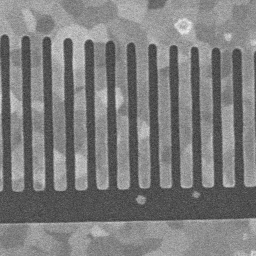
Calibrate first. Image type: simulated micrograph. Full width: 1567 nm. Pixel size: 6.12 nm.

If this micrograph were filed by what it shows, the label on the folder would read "groups of lines, slits or small figures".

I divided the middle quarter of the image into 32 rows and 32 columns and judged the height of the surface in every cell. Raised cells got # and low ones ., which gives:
..###...##...###..###...##...##.
...##...##...###..###...##...##.
...##...##...###..###...##...##.
...##...##...###..###...##...##.
...##...##...###..###...##...##.
...##...##...###..###...##...##.
...##...###..###..###...##...###
...##...###..###..###...##...###
...##...###..###..###...##...###
...##...###....#..###...##...###
...##...###..###..###...##...###
...##...###..###..###...##...###
...##...###..###..###...##...###
...##...###..###..###...##...###
...##...###..###..###...##...###
...##...###..###..###...###..###
...##...###..###..###...###..###
...##...###..###...##...###..###
...###..###..###...##...###..###
...###..###..###...##...###..###
...###..###..###...##...###..###
...###..###..###...##...###..###
...###..###..###...##...###..###
...###..###..###...##...###..###
...###..###..###...##...###..###
...###..###...##...##...###..###
...###..###...##...##...###..###
...###..###...##...##...###..###
...###..###..###...##...###..###
#..###..###..###...##...###..###
#..###..###...##...##...###...##
................................